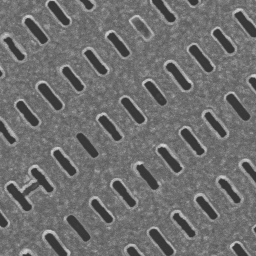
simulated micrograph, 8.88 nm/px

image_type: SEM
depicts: a regular array of holes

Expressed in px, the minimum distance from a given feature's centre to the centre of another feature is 28.5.